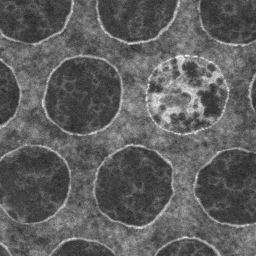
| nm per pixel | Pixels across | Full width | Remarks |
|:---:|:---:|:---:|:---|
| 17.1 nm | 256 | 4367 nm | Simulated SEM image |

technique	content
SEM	raised bodies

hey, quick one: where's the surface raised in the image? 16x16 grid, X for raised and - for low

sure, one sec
XXXX--XXXXX-XXXX
XXXX--XXXXX--XXX
-XX----XX----XXX
----------------
X--XXXX---------
X--XXXXX--------
X--XXXXX--------
X--XXXX---------
----------------
-XX----XXX----XX
XXXX--XXXXX--XXX
XXXX--XXXXX-XXXX
XXXX--XXXXX-XXXX
-XX----XXX---XXX
----------------
----XXX---XXX---